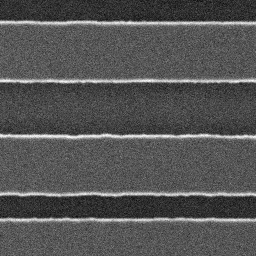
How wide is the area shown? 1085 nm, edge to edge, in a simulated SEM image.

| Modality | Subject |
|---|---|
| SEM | lines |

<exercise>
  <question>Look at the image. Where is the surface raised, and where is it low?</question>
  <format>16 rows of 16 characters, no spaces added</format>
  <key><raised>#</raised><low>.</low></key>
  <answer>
................
################
################
################
################
................
................
................
####.#########..
################
################
################
................
................
################
################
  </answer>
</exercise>